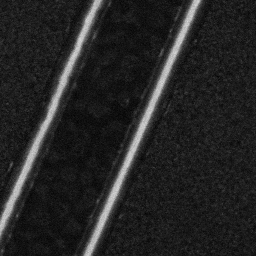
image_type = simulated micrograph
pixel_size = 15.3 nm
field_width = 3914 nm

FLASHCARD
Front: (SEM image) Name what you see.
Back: one or a few lines or trenches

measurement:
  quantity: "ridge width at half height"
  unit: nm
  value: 1380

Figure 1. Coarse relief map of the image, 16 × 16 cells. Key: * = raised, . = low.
......******....
.....*******....
.....******.....
.....******.....
....******......
....******......
...*******......
...******.......
..*******.......
..******........
..******........
.******.........
.******.........
******..........
******..........
******..........